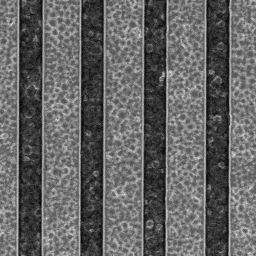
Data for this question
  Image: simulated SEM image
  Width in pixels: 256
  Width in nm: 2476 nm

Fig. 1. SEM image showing one or a few lines or trenches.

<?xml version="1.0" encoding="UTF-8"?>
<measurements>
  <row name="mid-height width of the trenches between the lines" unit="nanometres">231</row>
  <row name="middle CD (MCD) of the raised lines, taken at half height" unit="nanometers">370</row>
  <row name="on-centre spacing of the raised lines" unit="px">62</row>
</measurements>